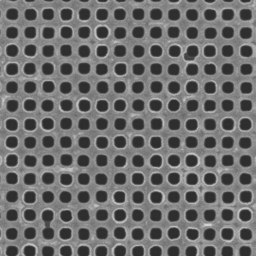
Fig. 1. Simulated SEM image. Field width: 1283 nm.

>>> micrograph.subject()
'a regular array of holes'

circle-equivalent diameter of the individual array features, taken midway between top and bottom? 60.9 nm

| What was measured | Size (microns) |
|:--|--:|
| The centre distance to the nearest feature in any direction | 0.0888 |